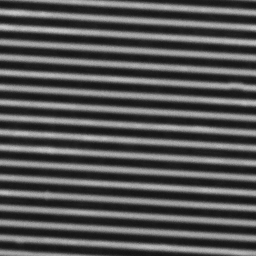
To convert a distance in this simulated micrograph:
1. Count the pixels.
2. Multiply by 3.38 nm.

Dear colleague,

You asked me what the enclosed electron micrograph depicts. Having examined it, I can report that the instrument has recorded parallel lines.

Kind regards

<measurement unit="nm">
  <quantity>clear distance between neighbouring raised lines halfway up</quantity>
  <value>29.9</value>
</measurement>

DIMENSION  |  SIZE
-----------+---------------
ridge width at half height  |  0.021 microns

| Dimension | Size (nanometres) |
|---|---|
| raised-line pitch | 50.7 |